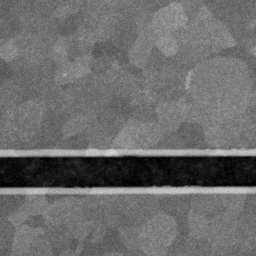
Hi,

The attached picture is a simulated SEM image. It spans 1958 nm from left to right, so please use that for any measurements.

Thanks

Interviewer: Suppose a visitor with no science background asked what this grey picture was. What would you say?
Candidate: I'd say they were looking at one or a few lines or trenches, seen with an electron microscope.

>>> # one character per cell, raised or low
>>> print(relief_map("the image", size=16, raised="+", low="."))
++++++++++++++++
++++++++++++++++
++++++++++++++++
++++++++++++++++
++++++++++++++++
++++++++++++++++
++++++++++++++++
++++++++++++++++
++++++++++++++++
+++++++.+++.....
................
................
++++++++++++++++
++++++++++++++++
++++++++++++++++
++++++++++++++++